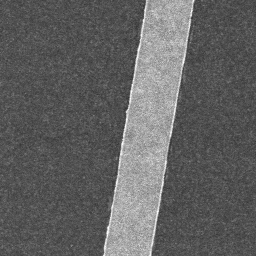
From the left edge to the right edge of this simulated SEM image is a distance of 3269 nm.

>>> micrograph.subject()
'one or a few lines or trenches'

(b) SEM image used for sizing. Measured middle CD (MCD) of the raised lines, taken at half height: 587 nm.